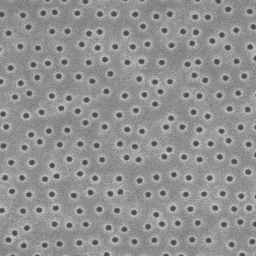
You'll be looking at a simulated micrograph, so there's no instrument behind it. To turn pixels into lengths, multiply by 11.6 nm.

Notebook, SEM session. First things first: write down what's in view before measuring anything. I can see a regular array of holes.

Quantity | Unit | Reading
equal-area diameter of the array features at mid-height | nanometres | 71.7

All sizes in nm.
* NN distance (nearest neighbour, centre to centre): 172